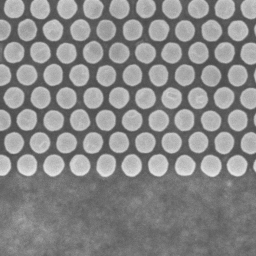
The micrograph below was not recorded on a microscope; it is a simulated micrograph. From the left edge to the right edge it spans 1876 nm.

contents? a regular array of raised bodies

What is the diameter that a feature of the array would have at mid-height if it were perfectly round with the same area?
150 nm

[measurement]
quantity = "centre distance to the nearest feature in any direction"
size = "188 nm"